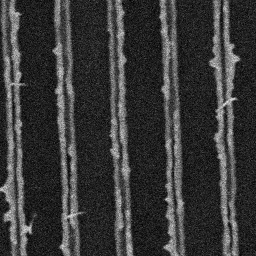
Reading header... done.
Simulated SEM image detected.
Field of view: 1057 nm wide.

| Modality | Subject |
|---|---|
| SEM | parallel lines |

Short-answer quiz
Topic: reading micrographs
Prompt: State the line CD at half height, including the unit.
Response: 55.2 nanometres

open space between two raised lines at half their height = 166 nm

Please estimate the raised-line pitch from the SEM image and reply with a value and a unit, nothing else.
218 nanometers